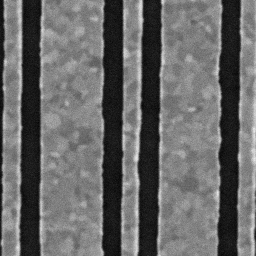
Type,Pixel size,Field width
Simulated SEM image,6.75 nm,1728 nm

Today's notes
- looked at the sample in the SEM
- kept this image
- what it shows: lines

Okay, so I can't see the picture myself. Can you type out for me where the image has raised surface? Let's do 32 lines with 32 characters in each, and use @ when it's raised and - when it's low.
-@@--@@@@@@@@---@@--@@@@@@@@--@@
-@@--@@@@@@@@---@@--@@@@@@@@--@@
-@@--@@@@@@@@---@@--@@@@@@@@--@@
-@@--@@@@@@@@---@@--@@@@@@@@--@@
-@@--@@@@@@@@---@@--@@@@@@@@--@@
-@@--@@@@@@@@---@@--@@@@@@@@--@@
-@@--@@@@@@@@---@@--@@@@@@@---@@
-@@--@@@@@@@@---@@--@@@@@@@---@@
@@@--@@@@@@@@---@@--@@@@@@@---@@
@@@--@@@@@@@@---@@--@@@@@@@---@@
@@@--@@@@@@@@---@@--@@@@@@@---@@
@@@--@@@@@@@@---@@--@@@@@@@@--@@
-@@--@@@@@@@@---@---@@@@@@@@--@@
@@@--@@@@@@@@--@@---@@@@@@@@--@@
@@@--@@@@@@@@--@@---@@@@@@@@--@@
@@@--@@@@@@@@--@@---@@@@@@@---@@
@@@--@@@@@@@@--@@---@@@@@@@---@@
@@@--@@@@@@@@--@@---@@@@@@@@--@@
@@@--@@@@@@@@--@@---@@@@@@@---@@
@@---@@@@@@@@--@@---@@@@@@@---@@
@@---@@@@@@@@--@@---@@@@@@@---@@
@@@--@@@@@@@@--@@---@@@@@@@---@@
@@@--@@@@@@@@--@@---@@@@@@@---@@
@@---@@@@@@@@--@@---@@@@@@@---@@
@@@--@@@@@@@@--@@---@@@@@@@---@@
@@@--@@@@@@@@--@@---@@@@@@@---@@
@@---@@@@@@@@--@@---@@@@@@@---@@
@@---@@@@@@@@--@@---@@@@@@@---@@
@@---@@@@@@@@--@@---@@@@@@@---@@
@@---@@@@@@@@--@@---@@@@@@@---@@
@@---@@@@@@@@--@@---@@@@@@@---@@
@@---@@@@@@@@--@@---@@@@@@@---@@